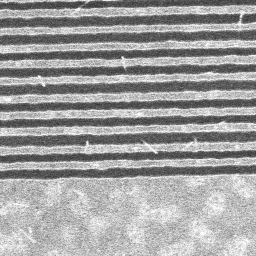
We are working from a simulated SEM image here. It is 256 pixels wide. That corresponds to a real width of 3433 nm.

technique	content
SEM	parallel lines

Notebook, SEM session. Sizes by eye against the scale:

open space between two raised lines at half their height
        0.117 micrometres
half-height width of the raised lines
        0.105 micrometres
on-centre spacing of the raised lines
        16.9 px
